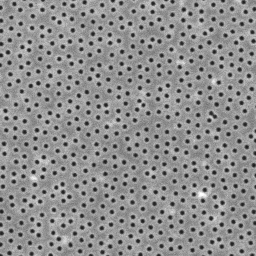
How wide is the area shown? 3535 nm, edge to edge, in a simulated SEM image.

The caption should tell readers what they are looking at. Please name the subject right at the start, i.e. a regular array of holes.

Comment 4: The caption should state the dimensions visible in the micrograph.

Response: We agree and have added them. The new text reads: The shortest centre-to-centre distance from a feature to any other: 129 nm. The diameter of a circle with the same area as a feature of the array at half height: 4.92 px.